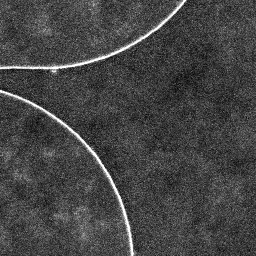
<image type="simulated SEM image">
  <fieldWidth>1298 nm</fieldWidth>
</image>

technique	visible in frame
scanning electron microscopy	one or a few lines or trenches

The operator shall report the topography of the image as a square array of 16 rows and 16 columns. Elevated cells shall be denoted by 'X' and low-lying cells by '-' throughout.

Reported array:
XXXXXXXXXXX-----
XXXXXXXXXX------
XXXXXXXXX-------
XXXXXXX---------
----------------
----------------
XX--------------
XXXX------------
XXXXX-----------
XXXXXX----------
XXXXXXX---------
XXXXXXX---------
XXXXXXXX--------
XXXXXXXX--------
XXXXXXXX--------
XXXXXXXX--------